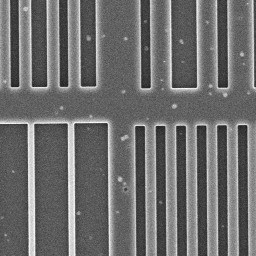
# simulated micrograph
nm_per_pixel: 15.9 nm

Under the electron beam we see groups of lines, slits or small figures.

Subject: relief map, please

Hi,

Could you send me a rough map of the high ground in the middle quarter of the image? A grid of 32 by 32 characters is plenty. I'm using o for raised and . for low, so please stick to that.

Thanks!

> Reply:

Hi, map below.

.ooo....ooooooooooo...ooooo.....
.ooo....ooooooooooo...ooooo.....
.ooo....ooooooooooo...ooooo.....
.ooo....ooooooooooo...ooooo.....
.ooo....ooooooooooo...ooooo.....
.ooo....ooooooooooo...ooooo.....
oooooooooooooooooooooooooooooooo
oooooooooooooooooooooooooooooooo
oooooooooooooooooooooooooooooooo
oooooooooooooooooooooooooooooooo
oooooooooooooooooooooooooooooooo
oooooooooooooooooooooooooooooooo
oooooooooooooooooooooooooooooooo
oooooooooooooooooooooooooooooooo
oooooooooooooooooooooooooooooooo
.o.........ooooooo..ooo..ooo..oo
.o.........ooooooo...oo..ooo...o
.o.........ooooooo...oo..ooo...o
.o.........ooooooo...oo..ooo...o
.o.........ooooooo...oo..ooo...o
.o.........ooooooo...oo..ooo...o
.o.........ooooooo...oo..ooo...o
.o.........ooooooo...oo..ooo...o
.o.........ooooooo...oo...oo...o
.o.........ooooooo...oo...oo...o
.o.........ooooooo...oo...oo...o
.o.........ooooooo...oo...oo...o
.o.........ooooooo...oo...oo...o
.o.........ooooooo...oo...oo...o
.o.........ooooooo...oo...oo...o
.o.........ooooooo...oo...oo...o
.o.........ooooooo...oo...oo...o